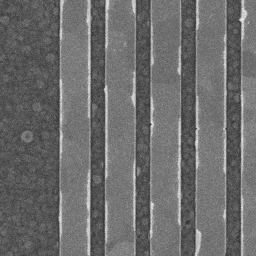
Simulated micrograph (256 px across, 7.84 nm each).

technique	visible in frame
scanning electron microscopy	parallel lines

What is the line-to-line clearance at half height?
120 nm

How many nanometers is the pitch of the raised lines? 356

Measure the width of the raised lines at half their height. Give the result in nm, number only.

233